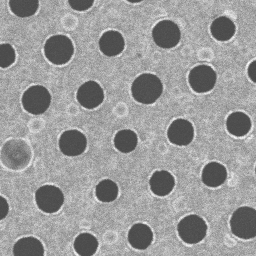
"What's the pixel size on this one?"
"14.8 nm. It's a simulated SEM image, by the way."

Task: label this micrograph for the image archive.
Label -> a regular array of holes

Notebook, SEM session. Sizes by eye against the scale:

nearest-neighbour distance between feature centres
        0.788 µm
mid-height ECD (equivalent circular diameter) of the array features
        0.408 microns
